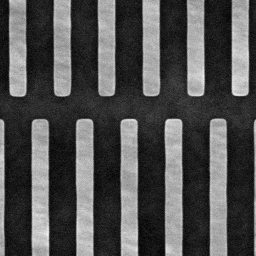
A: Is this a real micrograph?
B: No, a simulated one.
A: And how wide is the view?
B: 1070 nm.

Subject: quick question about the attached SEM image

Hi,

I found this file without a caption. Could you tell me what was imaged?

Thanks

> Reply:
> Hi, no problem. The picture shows groups of lines, slits or small figures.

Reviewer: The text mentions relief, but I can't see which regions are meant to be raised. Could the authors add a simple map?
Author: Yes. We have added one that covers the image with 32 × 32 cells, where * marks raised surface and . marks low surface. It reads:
.**....**...**....**...***...**.
.**....**...**....**...**....**.
.**....**...**....**....*....**.
.**....**...**....**....*....**.
.**....**...**....**...**....**.
.**....**...**....**...**....**.
.**....**...**....**...***...**.
.**....**...**....**....**...**.
.**....**...**....**....**...**.
.**....**...**....**....**...**.
.**....**...**....**....**...**.
.**....**...**....**....*....**.
................................
................................
................................
*...**....**...**....**...**....
*...**....**...**....**...**....
*...**....**...**....**...**....
*...**....**...**....**...**....
*...**....**...**....**...**....
*...**....**...**....**...**....
*...**....**...**....**...**....
*...**....**...**....**...**....
*...**....**...**....**...**....
*...**....**...**....**...**....
*...**....**...**....**...**....
*...**....**...**....**...**....
....**....**...**....**...**....
....**....**...**....**...**....
*...**....**...**....**...**....
*...**....**...**....**...**....
*...**....**...**....**...**....